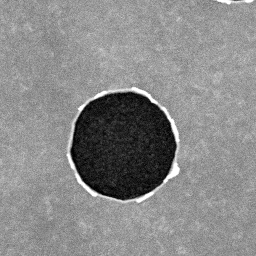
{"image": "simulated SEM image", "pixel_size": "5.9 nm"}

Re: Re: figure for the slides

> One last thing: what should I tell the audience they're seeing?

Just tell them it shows holes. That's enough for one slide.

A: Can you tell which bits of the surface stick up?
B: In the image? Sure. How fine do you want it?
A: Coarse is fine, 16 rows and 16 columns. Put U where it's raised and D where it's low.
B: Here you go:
UUUUUUUUUUUUUUUU
UUUUUUUUUUUUUUUU
UUUUUUUUUUUUUUUU
UUUUUUUUUUUUUUUU
UUUUUUUUUUUUUUUU
UUUUUUUUUUUUUUUU
UUUUUUDDDDUUUUUU
UUUUUDDDDDDUUUUU
UUUUUDDDDDDUUUUU
UUUUDDDDDDDUUUUU
UUUUUDDDDDDUUUUU
UUUUUDDDDDUUUUUU
UUUUUUUUUUUUUUUU
UUUUUUUUUUUUUUUU
UUUUUUUUUUUUUUUU
UUUUUUUUUUUUUUUU